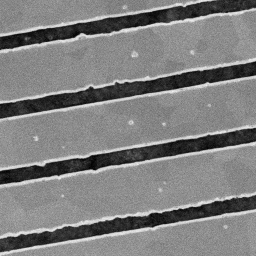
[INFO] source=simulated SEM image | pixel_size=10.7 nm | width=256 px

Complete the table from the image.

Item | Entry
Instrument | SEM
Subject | one or a few lines or trenches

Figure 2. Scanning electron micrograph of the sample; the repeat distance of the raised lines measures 710 nm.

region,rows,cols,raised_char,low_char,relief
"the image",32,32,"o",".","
ooooooooooooooooooooooo.........
oooooooooooooooooo............oo
ooooooooooo.............oooooooo
ooooo............ooooooooooooooo
..........oooooooooooooooooooooo
......oooooooooooooooooooooooooo
oooooooooooooooooooooooooooooooo
oooooooooooooooooooooooooooooooo
oooooooooooooooooooooooooo......
ooooooooooooooooooooo...........
oooooooooooooo.............ooooo
oooooooo.............ooooooooooo
oo............oooooooooooooooooo
.........ooooooooooooooooooooooo
...ooooooooooooooooooooooooooooo
oooooooooooooooooooooooooooooooo
oooooooooooooooooooooooooooo....
oooooooooooooooooooooo..........
oooooooooooooooo............oooo
ooooooooooo...........oooooooooo
ooooo............ooooooooooooooo
...........ooooooooooooooooooooo
.....ooooooooooooooooooooooooooo
oooooooooooooooooooooooooooooooo
ooooooooooooooooooooooooooooooo.
ooooooooooooooooooooooooo.......
ooooooooooooooooooo............o
ooooooooooooo............ooooooo
ooooooo............ooooooooooooo
o............ooooooooooooooooooo
.......ooooooooooooooooooooooooo
.ooooooooooooooooooooooooooooooo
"